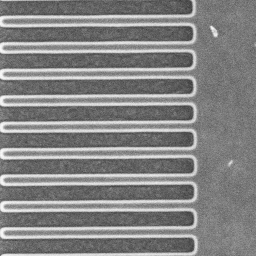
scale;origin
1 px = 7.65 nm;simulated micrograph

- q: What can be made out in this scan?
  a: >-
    groups of lines, slits or small figures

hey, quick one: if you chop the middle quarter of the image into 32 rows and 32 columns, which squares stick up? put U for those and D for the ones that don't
DDDDDDDDDDDDDDDDDDDDDDDDDDDDDDDD
UUUUUUUUUUUUUUUUUUUUUUUUUUUUUUUU
UUUUUUUUUUUUUUUUUUUUUUUUUUUUUUUU
UUDDDDDDDDDDDDDDDDDDDDDDDDDDDDDU
DDDDDDDDDDDDDDDDDDDDDDDDDDDDDDDD
DDDDDDDDDDDDDDDDDDDDDDDDDDDDDDDD
DDDDDDDDDDDDDDDDDDDDDDDDDDDDDDDD
DDDDDDDDDDDDDDDDDDDDDDDDDDDDDDDD
UUUUUUUUUUUUUUUUUUUUUUUUUUUUUUUU
UUUUUUUUUUUUUUUUUUUUUUUUUUUUUUUU
DDDDDDDDDDDDDDDDDDDDDDDDDDDDDDDD
DDDDDDDDDDDDDDDDDDDDDDDDDDDDDDDD
DDDDDDDDDDDDDDDDDDDDDDDDDDDDDDDD
DDDDDDDDDDDDDDDDDDDDDDDDDDDDDDDD
DDDDDDDDDDDDDDDDDDDDDDDDDDDDDDDU
UUUUUUUUUUUUUUUUUUUUUUUUUUUUUUUU
UUUUUUUUUUUUUUUUUUUUUUUUUUUUUUUU
DDDDDDDDDDDDDDDDDDDDDDDDDDDDDDDD
DDDDDDDDDDDDDDDDDDDDDDDDDDDDDDDD
DDDDDDDDDDDDDDDDDDDDDDDDDDDDDDDD
DDDDDDDDDDDDDDDDDDDDDDDDDDDDDDDD
UUUUUUUUUUUUUUUUUUUUUUUUUUUUUUUU
UUUUUUUUUUUUUUUUUUUUUUUUUUUUUUUU
DDDDDDDDDDDDDDDDDDDDDDDDDDDDDDDD
DDDDDDDDDDDDDDDDDDDDDDDDDDDDDDDD
DDDDDDDDDDDDDDDDDDDDDDDDDDDDDDDD
DDDDDDDDDDDDDDDDDDDDDDDDDDDDDDDD
DDDDDDDDDDDDDDDDDDDDDDDDDDDDDDDD
UUUUUUUUUUUUUUUUUUUUUUUUUUUUUUUU
UUUUUUUUUUUUUUUUUUUUUUUUUUUUUUUU
DDDDDDDDDDDDDDDDDDDDDDDDDDDDDDDD
DDDDDDDDDDDDDDDDDDDDDDDDDDDDDDDD